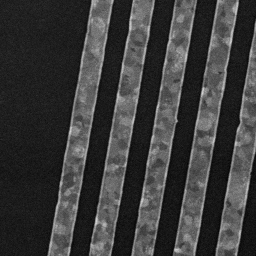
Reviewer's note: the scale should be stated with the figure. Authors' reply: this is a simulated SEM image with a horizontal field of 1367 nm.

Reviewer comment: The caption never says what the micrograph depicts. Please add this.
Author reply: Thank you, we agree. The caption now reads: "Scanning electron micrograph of parallel lines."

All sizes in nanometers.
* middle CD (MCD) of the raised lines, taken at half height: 105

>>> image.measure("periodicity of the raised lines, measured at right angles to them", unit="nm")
220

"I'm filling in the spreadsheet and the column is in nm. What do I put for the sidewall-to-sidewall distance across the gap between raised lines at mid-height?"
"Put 115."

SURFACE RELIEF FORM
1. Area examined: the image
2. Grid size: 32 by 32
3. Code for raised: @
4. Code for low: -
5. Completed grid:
------------@@---@@---@@---@@@--
-----------@@@--@@@---@@---@@@--
-----------@@@--@@@---@@---@@---
-----------@@---@@@--@@@---@@---
-----------@@---@@@--@@@---@@---
-----------@@---@@---@@@--@@@---
----------@@@---@@---@@---@@@--@
----------@@@--@@@---@@---@@---@
----------@@@--@@@--@@@---@@---@
----------@@---@@@--@@@---@@---@
----------@@---@@---@@@--@@@---@
----------@@---@@---@@---@@@---@
---------@@@---@@---@@---@@@--@@
---------@@@--@@@---@@---@@---@@
---------@@@--@@@---@@---@@---@@
---------@@---@@@--@@@---@@---@@
---------@@---@@---@@@--@@@---@@
---------@@---@@---@@---@@@--@@@
--------@@@---@@---@@---@@@--@@@
--------@@@--@@@---@@---@@---@@@
--------@@@--@@@--@@@---@@---@@-
--------@@---@@@--@@@---@@---@@-
--------@@---@@---@@@--@@@---@@-
--------@@---@@---@@@--@@@--@@@-
-------@@@---@@---@@---@@@--@@@-
-------@@@--@@@---@@---@@---@@@-
-------@@@--@@@--@@@---@@---@@@-
-------@@---@@@--@@@--@@@---@@--
-------@@---@@---@@@--@@@---@@--
-------@@---@@---@@@--@@@--@@@--
------@@@--@@@---@@---@@@--@@@--
------@@@--@@@---@@---@@---@@@--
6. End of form